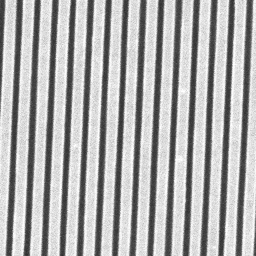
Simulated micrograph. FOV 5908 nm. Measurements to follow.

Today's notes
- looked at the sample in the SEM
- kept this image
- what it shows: parallel lines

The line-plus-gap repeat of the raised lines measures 408 nanometers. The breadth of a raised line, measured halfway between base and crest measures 262 nm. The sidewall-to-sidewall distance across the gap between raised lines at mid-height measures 0.156 um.